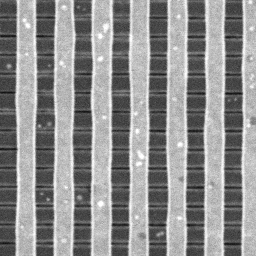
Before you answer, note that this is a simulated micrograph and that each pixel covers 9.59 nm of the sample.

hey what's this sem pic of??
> wiring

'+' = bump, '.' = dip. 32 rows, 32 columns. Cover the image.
..++...++...++..++...++...++..++
..++...++...++..++...++...++..++
..++...++...++..++...++...++...+
..++...++...++..++...++...++...+
..++...++...++..++...++...++..++
..++...++...++..+++..++...++..++
..++...++...++..+++..++...++..++
..++...++...++..+++..++...++..++
..++...++...++..+++..++...++..++
..++...++...++..++...++...++..++
..++...++...++..++...++...++..++
..++...++...++..++...++...++..++
..++...++...++..++...++...++..++
..++...++...++..++...++...++..++
..++...++...++..++...++...++..++
..++...++...++..++...++...++...+
..++...++...++..++...++...++..++
..++...++...++..++...++...++..++
..++...++...++..++...++...++..++
..++...++...++..++...++...++..++
..++...++...++..++...++...++..++
..++...++...++..++...++...++..++
..++...++...++..++...++...++..++
..++...++...++..++...++...++..++
..++...++...++..++...++...++..++
..++...++...++..++...++...++..++
..++...++...++..++...++...++..++
..++...++...++..++...++...++..++
..++...++...++..++...++...++..++
..++...++...++..++...++...++..++
..++...++...++..++...++...++..++
..++...++...++..++...++...++..++